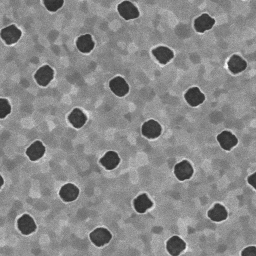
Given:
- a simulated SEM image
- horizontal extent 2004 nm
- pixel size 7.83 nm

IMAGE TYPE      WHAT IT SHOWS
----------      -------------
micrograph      a regular array of holes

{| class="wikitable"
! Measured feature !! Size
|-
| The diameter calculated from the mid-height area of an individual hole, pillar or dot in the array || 155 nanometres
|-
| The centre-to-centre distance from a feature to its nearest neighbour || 52.4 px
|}